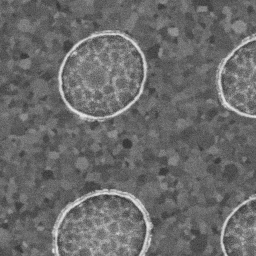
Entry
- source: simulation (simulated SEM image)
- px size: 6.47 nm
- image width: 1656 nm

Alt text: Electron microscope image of holes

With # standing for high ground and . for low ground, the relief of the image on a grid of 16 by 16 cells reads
################
################
#####...########
####.....#####..
####.....#####..
####.....#####..
####....######..
################
################
################
################
################
#####...########
####.....#####..
####.....#####..
####.....#####..